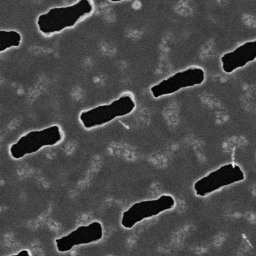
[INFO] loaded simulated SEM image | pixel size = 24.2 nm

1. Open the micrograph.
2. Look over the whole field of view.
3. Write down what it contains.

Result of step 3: holes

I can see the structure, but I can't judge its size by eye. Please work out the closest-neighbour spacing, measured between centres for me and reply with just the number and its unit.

1870 nanometres